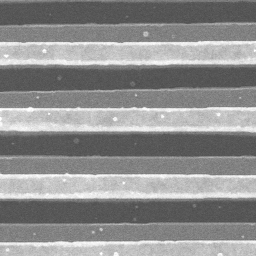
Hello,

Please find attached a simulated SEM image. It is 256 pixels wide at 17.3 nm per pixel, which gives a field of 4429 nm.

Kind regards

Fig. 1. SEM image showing lines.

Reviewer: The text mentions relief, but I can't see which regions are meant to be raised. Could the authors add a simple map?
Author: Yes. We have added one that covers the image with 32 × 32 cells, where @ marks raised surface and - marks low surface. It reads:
--------------------------------
--------------------------------
--------------------------------
@@@@@@@@@@@@@@@@@@@@@@@@@@@@@@@@
@@@@@@@@@@@@@@@@@@@@@@@@@@@@@@@@
@@@@@@@@@@@@@@@@@@@@@@@@@@@@@@@@
@@@@@@@@@@@@@@@@@@@@@@@@@@@@@@@@
@@@@@@@@@@@@@@@@@@@@@@@@@@@@@@@@
--------------------------------
--------------------------------
--------------------------------
-@-@@@@@@@@@@@@@@@@@@@@@@@@@@@@@
@@@@@@@@@@@@@@@@@@@@@@@@@@@@@@@@
@@@@@@@@@@@@@@@@@@@@@@@@@@@@@@@@
@@@@@@@@@@@@@@@@@@@@@@@@@@@@@@@@
@@@@@@@@@@@@@@@@@@@@@@@@@@@@@@@@
--------------------------------
--------------------------------
--------------------------------
--------------------------------
@@@@@@@@@@@@@@@@@@@@@@@@@@@@@@@@
@@@@@@@@@@@@@@@@@@@@@@@@@@@@@@@@
@@@@@@@@@@@@@@@@@@@@@@@@@@@@@@@@
@@@@@@@@@@@@@@@@@@@@@@@@@@@@@@@@
@@@@@@@@@@@@@@@@@@@@@@@@@@@@@@@@
--------------------------------
--------------------------------
--------------------------------
@@@@@@@@@@@@@@@@@@@@@@@@@@@@@@@@
@@@@@@@@@@@@@@@@@@@@@@@@@@@@@@@@
@@@@@@@@@@@@@@@@@@@@@@@@@@@@@@@@
@@@@@@@@@@@@@@@@@@@@@@@@@@@@@@@@